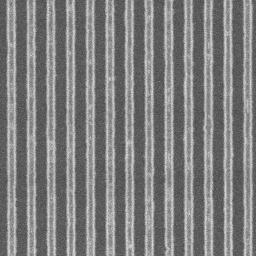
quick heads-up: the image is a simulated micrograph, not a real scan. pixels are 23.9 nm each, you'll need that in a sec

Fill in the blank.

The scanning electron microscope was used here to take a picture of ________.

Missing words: parallel lines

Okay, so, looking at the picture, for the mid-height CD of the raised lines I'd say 168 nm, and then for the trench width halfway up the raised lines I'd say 287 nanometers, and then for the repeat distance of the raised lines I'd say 471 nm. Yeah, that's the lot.